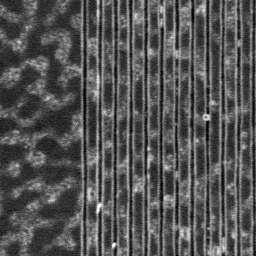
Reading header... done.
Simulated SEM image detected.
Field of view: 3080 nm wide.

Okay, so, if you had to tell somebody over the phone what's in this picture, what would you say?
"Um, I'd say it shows parallel lines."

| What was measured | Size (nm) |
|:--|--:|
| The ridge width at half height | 134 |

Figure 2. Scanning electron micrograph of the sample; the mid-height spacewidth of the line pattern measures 51.1 nm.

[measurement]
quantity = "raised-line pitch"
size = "185 nm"